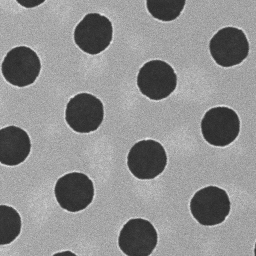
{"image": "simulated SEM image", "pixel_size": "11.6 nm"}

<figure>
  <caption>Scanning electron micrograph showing a regular array of holes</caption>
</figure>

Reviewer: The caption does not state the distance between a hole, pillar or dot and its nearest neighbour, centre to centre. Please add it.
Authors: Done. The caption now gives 913 nm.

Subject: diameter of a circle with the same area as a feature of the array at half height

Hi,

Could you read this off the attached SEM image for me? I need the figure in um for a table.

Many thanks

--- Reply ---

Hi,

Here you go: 0.463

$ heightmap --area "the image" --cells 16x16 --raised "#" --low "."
#########..#####
#####..#########
#####..######..#
..###########..#
..#######..#####
#########..#####
####..##########
####..#######..#
..###########..#
..######..######
########..######
####..##########
####..######..##
.###########..##
.#######..######
########..######